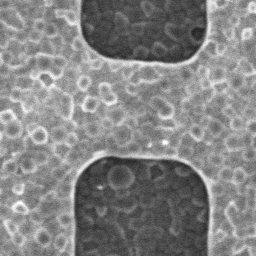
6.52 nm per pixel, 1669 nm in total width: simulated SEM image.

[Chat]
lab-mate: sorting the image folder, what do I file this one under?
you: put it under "holes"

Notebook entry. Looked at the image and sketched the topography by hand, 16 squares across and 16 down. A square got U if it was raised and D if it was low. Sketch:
UUUUUDDDDDDDDUUU
UUUUUDDDDDDDDUUU
UUUUUDDDDDDDDUUU
UUUUUUDDDDDDUUUU
UUUUUUUUUUUUUUUU
UUUUUUUUUUUUUUUU
UUUUUUUUUUUUUUUU
UUUUUUUUUUUUUUUU
UUUUUUUUUUUUUUUU
UUUUUUUUUUUUUUUU
UUUUUDDDDDDDUUUU
UUUUUDDDDDDDDUUU
UUUUUDDDDDDDDUUU
UUUUUDDDDDDDDUUU
UUUUUDDDDDDDDUUU
UUUUUDDDDDDDDUUU